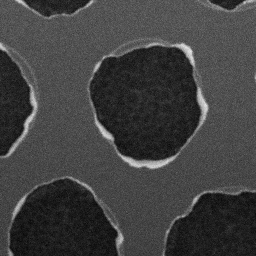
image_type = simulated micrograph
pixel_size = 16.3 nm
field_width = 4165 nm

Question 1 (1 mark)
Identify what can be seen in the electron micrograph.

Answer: holes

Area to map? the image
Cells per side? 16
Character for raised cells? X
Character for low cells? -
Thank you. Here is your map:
XX---XXXXXXXXX-X
XXXXXXXXXXXXXXXX
XXXXXXXXXXXXXXXX
-XXXXXX-----XXXX
-XXXXX------XXXX
--XXXX------XXXX
--XXXX-------XXX
--XXXX-------XXX
-XXXXXX-----XXXX
-XXXXXX----XXXXX
XXXXXXXXXXXXXXXX
XXX--XXXXXXXXXXX
XX----XXXXXX----
X------XXXX-----
X------XXXX-----
X------XXX------